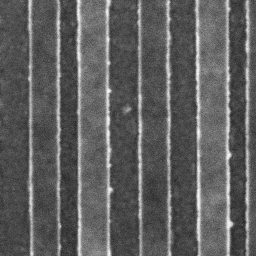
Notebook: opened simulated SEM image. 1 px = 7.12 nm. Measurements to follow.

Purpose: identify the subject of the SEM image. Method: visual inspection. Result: lines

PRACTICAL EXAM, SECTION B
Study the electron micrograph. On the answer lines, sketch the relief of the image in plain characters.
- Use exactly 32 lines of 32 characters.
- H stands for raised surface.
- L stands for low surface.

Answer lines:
LLLLHHHLLLHHHLLLLHHHHLLLLHHHLLLH
LLLLHHHLLLHHHLLLLHHHHLLLLHHHLLLH
LLLLHHHLLLHHHLLLLHHHHLLLLHHHLLLH
LLLLHHHLLLHHHLLLLHHHHLLLLHHHLLLH
LLLLHHHLLLHHHHLLLHHHHLLLLHHHLLLH
LLLLHHHLLLHHHHLLLHHHHLLLLHHHHLLH
LLLLHHHLLLHHHLLLLHHHHLLLLHHHLLLH
LLLLHHHLLLHHHLLLLHHHHLLLLHHHLLLH
LLLLHHHLLLHHHLLLLHHHHLLLLHHHLLLH
LLLLHHHLLLHHHLLLLHHHHLLLLHHHHLLH
LLLLHHHLLLHHHLLLLHHHHLLLLHHHLLLH
LLLLHHHLLLHHHHLLLHHHHLLLLHHHHLLH
LLLLHHHLLLHHHLLLLHHHHLLLLHHHHLLH
LLLLHHHLLLHHHHLLLHHHHLLLLHHHHLLH
LLLLHHHLLLHHHHLLLHHHHLLLLHHHHLLH
LLLLHHHLLLHHHHLLLHHHHLLLLHHHHLLH
LLLLHHHHLLHHHHLLLHHHHLLLLHHHHLLH
LLLLHHHLLLHHHHLLLHHHHLLLLHHHLLLH
LLLLHHHHLLHHHHLLLHHHHLLLLHHHLLLH
LLLLHHHLLLHHHHLLLHHHHLLLLHHHHLLH
LLLLHHHLLLHHHHLLLHHHHLLLLHHHHLLH
LLLLHHHLLLHHHHLLLHHHHLLLLHHHHLLH
LLLLHHHLLLHHHHLLLHHHHLLLLHHHHLLH
LLLLHHHLLLHHHHLLLHHHHLLLLHHHHLLH
LLLLHHHLLLHHHHLLLHHHHLLLLHHHHLLH
LLLLHHHLLLHHHHLLLHHHHLLLLHHHHLLH
LLLLHHHLLLHHHHLLLHHHHLLLLHHHHLLH
LLLLHHHLLLHHHHLLLHHHHLLLLHHHHLLH
LLLLHHHHLLHHHHLLLLHHHLLLLHHHHLLH
LLLLHHHLLLHHHHLLLHHHHLLLLHHHHLLH
LLLLHHHHLLHHHHLLLLHHHLLLLHHHHLLH
LLLLHHHHLLHHHHLLLLHHHLLLLHHHHLLH